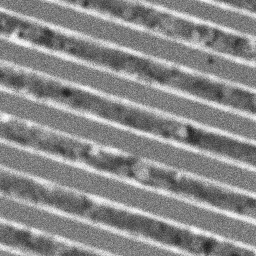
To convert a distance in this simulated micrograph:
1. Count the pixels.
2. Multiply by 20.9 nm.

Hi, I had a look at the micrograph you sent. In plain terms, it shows lines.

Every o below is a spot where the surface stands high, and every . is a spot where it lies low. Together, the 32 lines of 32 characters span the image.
........oooooooooo.........ooooo
o..........oooooooooo.........oo
oooo...........ooooooooo........
ooooooo..........ooooooooooo....
oooooooooo...........oooooooooo.
...oooooooooo...........oooooooo
......ooooooooooo..........ooooo
..........ooooooooo...........oo
oo...........oooooooooo.........
ooooo...........oooooooooo......
oooooooo...........oooooooooo...
..oooooooooo..........oooooooooo
.....oooooooooo..........ooooooo
........oooooooooo..........oooo
...........oooooooooo..........o
ooo...........oooooooooo........
oooooo...........oooooooooo.....
ooooooooo............oooooooooo.
...ooooooooo............oooooooo
......oooooooooo...........ooooo
.........ooooooooo............oo
o...........oooooooooo..........
ooooo...........ooooooooo.......
ooooooo...........oooooooooo....
..ooooooooo...........oooooooooo
.....ooooooooo...........ooooooo
.......oooooooooo...........oooo
..........ooooooooooo..........o
ooo..........oooooooooo.........
oooooo...........oooooooooo.....
ooooooooo...........oooooooooo..
...ooooooooo...........ooooooooo